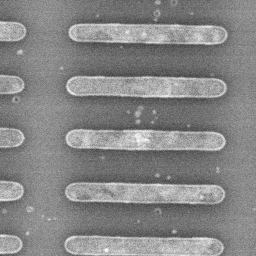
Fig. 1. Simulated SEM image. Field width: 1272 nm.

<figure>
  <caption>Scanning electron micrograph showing groups of lines, slits or small figures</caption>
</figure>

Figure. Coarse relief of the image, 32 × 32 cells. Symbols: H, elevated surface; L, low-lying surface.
LLLLLLLLLLLLLLLLLLLLLLLLLLLLLLLL
LLLLLLLLLLLLLLLLLLLLLLLLLLLLLLLL
LLLLLLLLLLLLLLLLLLLLLLLLLLLLLLLL
HHHLLLLLLHHHHHHHHHHHHHHHHHHHLLLL
HHHLLLLLLHHHHHHHHHHHHHHHHHHHLLLL
LLLLLLLLLLLLLLLLLLLLLLLLLLLLLLLL
LLLLLLLLLLLLLLLLLLLLLLLLLLLLLLLL
LLLLLLLLLLLLLLLLLLLLLLLLLLLLLLLL
LLLLLLLLLLLLLLLLLLLLLLLLLLLLLLLL
LLLLLLLLLLLLLLLLLLLLLLLLLLLLLLLL
HHHLLLLLLHHHHHHHHHHHHHHHHHHHLLLL
HHLLLLLLLHHHHHHHHHHHHHHHHHHHLLLL
LLLLLLLLLLLLLLLLLLLLLLLLLLLLLLLL
LLLLLLLLLLLLLLLLLLLLLLLLLLLLLLLL
LLLLLLLLLLLLLLLLLLLLLLLLLLLLLLLL
LLLLLLLLLLLLLLLLLLLLLLLLLLLLLLLL
HHLLLLLLLHHHHHHHHHHHLLLLLLLLLLLL
HHHLLLLLHHHHHHHHHHHHHHHHHHHHLLLL
LLLLLLLLLLLLLLLHHHHHHHHHHHHLLLLL
LLLLLLLLLLLLLLLLLLLLLLLLLLLLLLLL
LLLLLLLLLLLLLLLLLLLLLLLLLLLLLLLL
LLLLLLLLLLLLLLLLLLLLLLLLLLLLLLLL
LLLLLLLLLLLLLLLLLLLLLLLLLLLLLLLL
HHHLLLLLLHHHHHHHHHHHHHHHHHHHLLLL
HHHLLLLLHHHHHHHHHHHHHHHHHHHHLLLL
LLLLLLLLLLLLLLLLLLLLLLLLLLLLLLLL
LLLLLLLLLLLLLLLLLLLLLLLLLLLLLLLL
LLLLLLLLLLLLLLLLLLLLLLLLLLLLLLLL
LLLLLLLLLLLLLLLLLLLLLLLLLLLLLLLL
HHLLLLLLLLLLLLLLLLLLLLLLLLLLLLLL
HHHLLLLLHHHHHHHHHHHHHHHHHHHHLLLL
HHLLLLLLLHHHHHHHHHHHHHHHHHHHLLLL